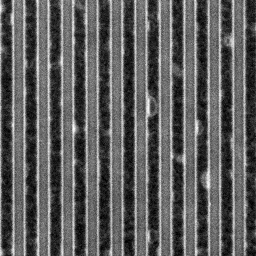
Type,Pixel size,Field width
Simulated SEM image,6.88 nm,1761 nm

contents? parallel lines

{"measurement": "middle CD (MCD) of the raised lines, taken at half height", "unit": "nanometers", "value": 98.8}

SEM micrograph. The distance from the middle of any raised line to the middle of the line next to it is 168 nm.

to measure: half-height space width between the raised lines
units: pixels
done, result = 9.87